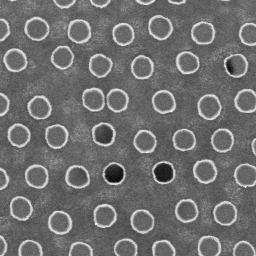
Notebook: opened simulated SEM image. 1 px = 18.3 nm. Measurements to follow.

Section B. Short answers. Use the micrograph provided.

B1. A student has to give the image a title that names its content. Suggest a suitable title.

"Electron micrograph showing a regular array of raised bodies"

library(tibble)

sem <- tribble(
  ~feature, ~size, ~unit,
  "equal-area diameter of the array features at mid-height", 405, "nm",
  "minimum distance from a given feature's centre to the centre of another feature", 0.668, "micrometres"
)